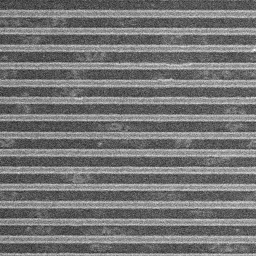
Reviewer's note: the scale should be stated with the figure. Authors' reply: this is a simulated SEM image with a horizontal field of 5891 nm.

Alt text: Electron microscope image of parallel lines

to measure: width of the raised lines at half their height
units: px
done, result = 6.25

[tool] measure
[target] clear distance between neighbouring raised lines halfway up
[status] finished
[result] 268 nanometres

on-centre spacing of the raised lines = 17.4 px